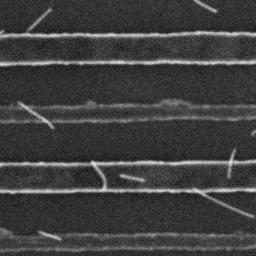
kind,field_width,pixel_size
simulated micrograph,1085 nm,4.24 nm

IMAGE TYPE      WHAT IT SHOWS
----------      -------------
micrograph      lines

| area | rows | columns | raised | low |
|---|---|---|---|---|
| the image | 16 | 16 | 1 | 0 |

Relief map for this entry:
0000000000000000
0000000000000000
1111111111111111
1111111111111111
0000000000000000
0000000000000000
0000000000000000
0000000000000000
0000000000000000
0000000000000000
1111111111111111
1111111111111111
0000000000000000
0000000000000000
0000000000000000
0000000000000000